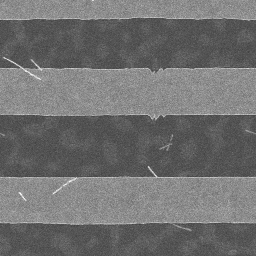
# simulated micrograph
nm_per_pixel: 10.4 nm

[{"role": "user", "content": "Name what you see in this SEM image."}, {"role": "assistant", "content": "one or a few lines or trenches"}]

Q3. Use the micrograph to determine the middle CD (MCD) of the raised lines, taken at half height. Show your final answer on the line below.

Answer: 479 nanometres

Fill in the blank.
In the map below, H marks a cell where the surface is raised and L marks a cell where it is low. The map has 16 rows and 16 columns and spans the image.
HHHHHHHHHHHHHHHH
LLLLLLLLLLLLLLLL
LLLLLLLLLLLLLLLL
LLLLLLLLLLLLLLLL
HHHHHHHHHHHHHHHH
HHHHHHHHHHHHHHHH
HHHHHHHHHHHHHHHH
LLLLLLLLLLLLLLLL
LLLLLLLLLLLLLLLL
LLLLLLLLLLLLLLLL
LLLLLLLLLLLLLLLL
HHHHHHHHHHHHHHHH
HHHHHHHHHHHHHHHH
HHHHHHHHHHHHHHHH
LLLLLLLLLLLLLLLL
LLLLLLLLLLLLLLLL